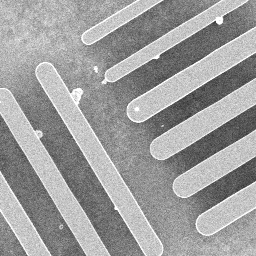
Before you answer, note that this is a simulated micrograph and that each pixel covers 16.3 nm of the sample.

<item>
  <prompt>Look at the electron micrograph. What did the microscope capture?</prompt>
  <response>groups of lines, slits or small figures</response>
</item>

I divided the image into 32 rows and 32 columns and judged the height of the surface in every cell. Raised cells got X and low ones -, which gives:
----------------XXXX-------XXX--
---------------XXX-------XXXX---
-------------XXX--------XXXX----
-----------XXXX-------XXX-------
----------XXX-------XXXX------XX
-------------------XXX------XXXX
-----------------XXX-------XXXXX
---------------XXXX------XXXXX--
-----XX-------XXX------XXXXXX---
-----XX------XX-------XXXXX-----
-----XXX------------XXXXX------X
X-----XXX---------XXXXXX-----XXX
XX----XXX--------XXXXX------XXXX
XXX----XXX------XXXXX-----XXXXX-
XXX-----XX------XXX-----XXXXXX--
-XXX----XXX-----------XXXXXX----
-XXX-----XXX---------XXXXX------
--XXX----XXX-------XXXXXX-----XX
---XXX----XXX------XXXX-----XXXX
---XXX-----XXX-----XX-----XXXXXX
----XXX----XXX-----------XXXXX--
----XXX-----XXX--------XXXXXX---
X----XXX----XXX-------XXXXX-----
X-----XXX----XXX------XXX------X
XX----XXX-----XXX-----XX-----XXX
XX-----XXX----XXX----------XXXXX
XXX----XXX-----XXX--------XXXXX-
-XXX----XXX----XXX-------XXXX---
-XXX-----XXX----XXX------XXX----
--XXX----XXX-----XXX------------
---XXX----XXX----XXX------------
---XXX-----XX-----XX------------